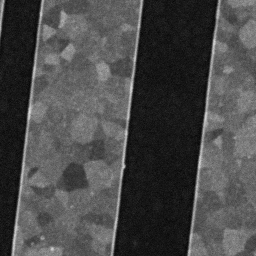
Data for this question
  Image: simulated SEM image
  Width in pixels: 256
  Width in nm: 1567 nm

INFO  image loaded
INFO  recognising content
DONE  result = one or a few lines or trenches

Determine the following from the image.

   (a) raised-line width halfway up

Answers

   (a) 610 nanometres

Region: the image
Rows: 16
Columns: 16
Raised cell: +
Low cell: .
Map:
...++++++.....++
..+++++++.....++
..+++++++....+++
..++++++.....+++
..++++++.....+++
..++++++.....+++
..++++++.....+++
..++++++.....+++
..++++++.....+++
..++++++.....+++
.+++++++....++++
.+++++++....++++
.++++++.....++++
.++++++.....++++
.++++++.....++++
.++++++.....++++